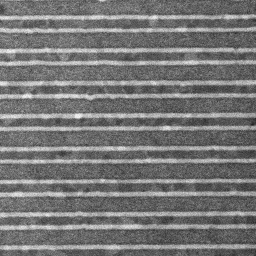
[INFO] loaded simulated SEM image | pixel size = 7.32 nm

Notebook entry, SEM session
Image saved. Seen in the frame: parallel lines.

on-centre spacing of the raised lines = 0.24 microns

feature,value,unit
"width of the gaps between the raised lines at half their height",144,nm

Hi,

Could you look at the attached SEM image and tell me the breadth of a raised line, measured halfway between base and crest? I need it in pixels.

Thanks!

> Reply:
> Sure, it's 13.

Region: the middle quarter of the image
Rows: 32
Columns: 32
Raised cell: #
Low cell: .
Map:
................................
................................
................................
................................
................................
################################
################################
################################
................................
................................
................................
................................
................................
################################
################################
################################
................................
................................
................................
................................
................................
################################
################################
################################
................................
................................
................................
................................
................................
################################
################################
################################